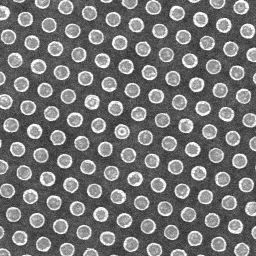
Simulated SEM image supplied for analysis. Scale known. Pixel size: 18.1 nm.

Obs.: a regular array of raised bodies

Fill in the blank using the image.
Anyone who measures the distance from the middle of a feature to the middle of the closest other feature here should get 436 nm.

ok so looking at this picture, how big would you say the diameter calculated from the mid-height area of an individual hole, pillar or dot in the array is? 257 nm